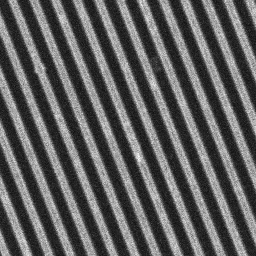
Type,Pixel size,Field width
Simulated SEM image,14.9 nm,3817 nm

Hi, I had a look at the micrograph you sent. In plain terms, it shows parallel lines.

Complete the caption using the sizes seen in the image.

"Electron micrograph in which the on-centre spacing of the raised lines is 0.298 um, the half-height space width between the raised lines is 0.172 microns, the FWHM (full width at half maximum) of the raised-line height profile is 0.127 µm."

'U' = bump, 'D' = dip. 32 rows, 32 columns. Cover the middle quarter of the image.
DDDUUDDDDUUDDDUUDDDUUDDDDUUDDDUU
UDDDUUDDDUUDDDUUUDDDUUDDDUUUDDDU
UDDDUUDDDUUUDDDUUDDDUUDDDDUUDDDU
UDDDUUUDDDUUDDDUUUDDDUUDDDUUDDDU
UUDDDUUDDDUUUDDDUUDDDUUDDDUUDDDD
UUDDDUUDDDDUUDDDUUDDDUUDDDDUUDDD
UUUDDDUUDDDUUDDDUUUDDDUUDDDUUDDD
DUUDDDUUDDDUUUDDDUUDDDUUDDDDUUDD
DUUDDDUUUDDDUUDDDUUUDDDUUDDDUUDD
DUUUDDDUUDDDUUUDDDUUDDDUUDDDUUDD
DDUUDDDUUUDDDUUDDDUUDDDUUDDDDUUD
DDUUUDDDUUDDDUUDDDUUUDDDUUDDDUUD
DDDUUDDDUUDDDUUUDDDUUDDDUUDDDDUU
DDDUUDDDUUUDDDUUDDDUUUDDDUUDDDUU
DDDDUUDDDUUDDDUUUDDDUUDDDUUDDDUU
UDDDUUDDDUUUDDDUUDDDUUDDDUUDDDDU
UDDDUUUDDDUUDDDUUDDDUUUDDDUUDDDU
UUDDDUUDDDUUDDDUUUDDDUUDDDUUDDDD
UUDDDUUDDDUUUDDDUUDDDUUDDDDUUDDD
UUDDDUUUDDDUUDDDUUDDDDUUDDDUUDDD
DUUDDDUUDDDUUDDDDUUDDDUUDDDUUDDD
DUUDDDUUDDDDUUDDDUUDDDUUUDDDUUDD
DUUDDDDUUDDDUUDDDUUUDDDUUDDDUUDD
DDUUDDDUUDDDUUUDDDUUDDDUUDDDDUUD
DDUUDDDUUUDDDUUDDDUUDDDDUUDDDUUD
DDDUDDDDUUDDDUUDDDDUUDDDUUDDDUUD
DDDUUDDDUUDDDDUUDDDUUDDDUUUDDDUU
DDDUUDDDDUUDDDUUDDDUUUDDDUUDDDUU
DDDDUUDDDUUDDDUUUDDDUUDDDUUDDDDU
UDDDUUDDDUUUDDDUUDDDUUDDDDUUDDDU
UDDDDUDDDDUUDDDUUDDDDUUDDDUUDDDU
UUDDDUUDDDUUDDDDUUDDDUUDDDUUUDDD